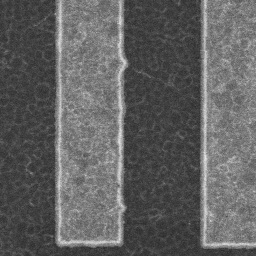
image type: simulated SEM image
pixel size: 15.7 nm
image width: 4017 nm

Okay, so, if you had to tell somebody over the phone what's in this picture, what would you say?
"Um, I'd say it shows one or a few lines or trenches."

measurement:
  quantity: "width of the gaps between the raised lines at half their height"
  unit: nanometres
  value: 1340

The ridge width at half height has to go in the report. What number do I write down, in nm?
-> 940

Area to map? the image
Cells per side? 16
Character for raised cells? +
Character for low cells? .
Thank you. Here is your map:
....+++......+++
....+++......+++
....+++......+++
....++++.....+++
....++++.....+++
....+++......+++
....++++.....+++
....++++.....+++
....+++......+++
....++++.....+++
....+++......+++
....+++......+++
....+++......+++
....+++......+++
....+++......+++
................